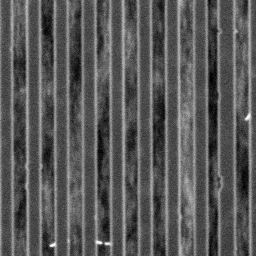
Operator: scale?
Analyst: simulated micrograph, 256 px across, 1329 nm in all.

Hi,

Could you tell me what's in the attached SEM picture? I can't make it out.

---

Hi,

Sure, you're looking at parallel lines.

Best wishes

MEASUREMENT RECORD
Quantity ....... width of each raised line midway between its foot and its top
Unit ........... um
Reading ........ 0.0723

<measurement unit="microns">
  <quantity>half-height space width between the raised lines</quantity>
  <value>0.0726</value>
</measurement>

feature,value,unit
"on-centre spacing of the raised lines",143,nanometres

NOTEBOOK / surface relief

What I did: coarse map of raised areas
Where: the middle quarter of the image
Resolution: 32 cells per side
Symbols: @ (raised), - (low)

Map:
@----@@@----@@@----@@@---@@@@---
@----@@@----@@@----@@@---@@@@---
@----@@@----@@@----@@@---@@@@---
@----@@@----@@@----@@@---@@@@---
@----@@@----@@@----@@@---@@@@---
@----@@@----@@@----@@@----@@@---
@----@@@----@@@----@@@----@@@---
@----@@@----@@@----@@@----@@@---
@----@@@----@@@----@@@----@@@---
@----@@@----@@@----@@@----@@@---
@----@@@----@@@----@@@----@@@---
@----@@@----@@@----@@@----@@@---
@----@@@----@@@----@@@----@@@---
@----@@@----@@@----@@@----@@@---
@----@@@----@@@----@@@----@@@---
@----@@@----@@@----@@@----@@@---
@----@@@----@@@----@@@----@@@---
@----@@@----@@@----@@@----@@@---
@----@@@----@@@----@@@----@@@---
@----@@@----@@@----@@@----@@@---
@----@@@----@@@----@@@----@@@---
@----@@@----@@@----@@@----@@@---
@----@@@----@@@----@@@----@@@---
@----@@@----@@@----@@@----@@@---
@----@@@----@@@----@@@----@@@---
@----@@@----@@@----@@@----@@@---
@----@@@----@@@----@@@----@@@---
@----@@@----@@@----@@@----@@@---
@----@@@----@@@----@@@----@@@---
@----@@@----@@@----@@@----@@@---
@----@@@----@@@----@@@----@@@---
@----@@@----@@@----@@@----@@@---